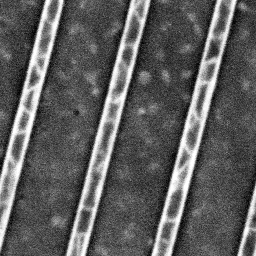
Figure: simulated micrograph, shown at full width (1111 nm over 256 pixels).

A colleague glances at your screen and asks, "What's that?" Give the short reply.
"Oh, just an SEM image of one or a few lines or trenches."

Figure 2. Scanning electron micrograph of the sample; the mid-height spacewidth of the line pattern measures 292 nanometres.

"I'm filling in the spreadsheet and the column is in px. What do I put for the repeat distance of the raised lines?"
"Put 83.2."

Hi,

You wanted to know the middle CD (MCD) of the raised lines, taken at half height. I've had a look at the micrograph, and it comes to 68.9 nanometers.